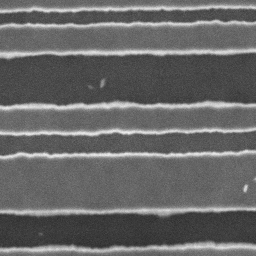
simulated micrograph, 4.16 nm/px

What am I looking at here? lines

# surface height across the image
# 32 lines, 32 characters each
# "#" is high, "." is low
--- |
################################
################################
################################
################################
################################
################################
#########################.###...
................................
................................
................................
................................
................................
................................
################################
################################
################################
################################
################################
################################
################################
################################
################################
################################
################################
################################
################################
#######...####..................
................................
................................
................................
................................
################################